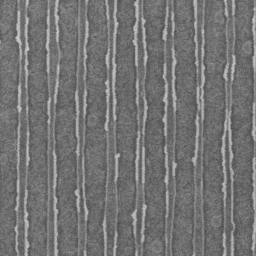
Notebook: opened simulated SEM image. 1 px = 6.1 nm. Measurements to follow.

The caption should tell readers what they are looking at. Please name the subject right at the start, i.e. parallel lines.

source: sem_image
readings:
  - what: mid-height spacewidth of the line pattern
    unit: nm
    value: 124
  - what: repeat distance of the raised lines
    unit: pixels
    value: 29.4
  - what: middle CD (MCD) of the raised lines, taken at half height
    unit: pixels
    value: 9.25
